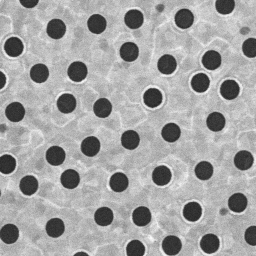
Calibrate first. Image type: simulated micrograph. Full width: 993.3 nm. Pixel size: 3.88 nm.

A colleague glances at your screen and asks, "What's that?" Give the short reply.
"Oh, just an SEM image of a regular array of holes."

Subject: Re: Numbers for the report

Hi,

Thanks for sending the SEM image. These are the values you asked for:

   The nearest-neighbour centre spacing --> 142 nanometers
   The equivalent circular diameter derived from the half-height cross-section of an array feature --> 78.1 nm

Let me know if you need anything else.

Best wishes